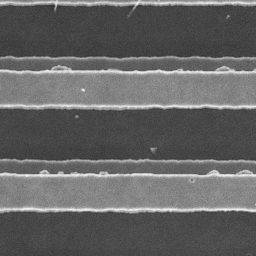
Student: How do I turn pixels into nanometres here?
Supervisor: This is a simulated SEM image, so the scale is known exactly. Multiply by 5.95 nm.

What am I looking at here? lines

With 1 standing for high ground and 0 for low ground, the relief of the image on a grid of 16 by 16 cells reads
0000000000000000
0000000000000000
0000000000000000
0000000000000000
1111111111111111
1111111111111111
1111111111111111
0000000000000000
0000000000000000
0000000000000000
1111111111111111
1111111111111111
1111111111111111
0000000000000000
0000000000000000
0000000000000000